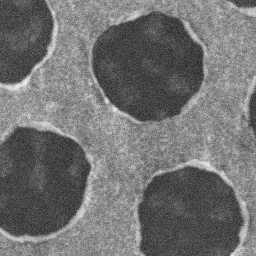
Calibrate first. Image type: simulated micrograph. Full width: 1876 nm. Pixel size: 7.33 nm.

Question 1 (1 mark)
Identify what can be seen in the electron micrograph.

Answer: holes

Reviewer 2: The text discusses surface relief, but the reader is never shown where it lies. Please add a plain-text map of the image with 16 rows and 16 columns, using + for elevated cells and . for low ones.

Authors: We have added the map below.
...++++++++++++.
...++++....+++++
...+++......++++
...+++.......+++
..++++.......+++
++++++.......+++
+++++++.....+++.
++++++++..++++++
+...++++++++++++
.....+++++++++++
......+++++..+++
.....++++.....++
.....++++......+
.....++++......+
....+++++......+
+++++++++......+